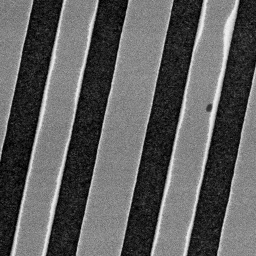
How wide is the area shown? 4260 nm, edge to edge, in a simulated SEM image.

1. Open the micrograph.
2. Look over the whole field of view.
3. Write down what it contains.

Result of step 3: lines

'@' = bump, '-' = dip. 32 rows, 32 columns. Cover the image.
@@@@----@@@@----@@@@@@---@@@@@--
@@@@----@@@@----@@@@@----@@@@@--
@@@@---@@@@@----@@@@@----@@@@---
@@@----@@@@@---@@@@@@----@@@@---
@@@----@@@@----@@@@@@----@@@@---
@@@----@@@@----@@@@@@---@@@@@---
@@@----@@@@----@@@@@----@@@@----
@@@---@@@@@----@@@@@----@@@@----
@@----@@@@@---@@@@@@----@@@@----
@@----@@@@----@@@@@@---@@@@@----
@@----@@@@----@@@@@----@@@@@---@
@@----@@@@----@@@@@----@@@@----@
@@---@@@@@----@@@@@----@@@@----@
@----@@@@----@@@@@@----@@@@----@
@----@@@@----@@@@@@----@@@@----@
@----@@@@----@@@@@----@@@@@---@@
@----@@@@----@@@@@----@@@@----@@
----@@@@@----@@@@@----@@@@----@@
----@@@@----@@@@@@----@@@@----@@
----@@@@----@@@@@@----@@@@----@@
----@@@@----@@@@@----@@@@@---@@@
----@@@@----@@@@@----@@@@----@@@
---@@@@@---@@@@@@----@@@@----@@@
---@@@@----@@@@@@----@@@@----@@@
---@@@@----@@@@@@---@@@@@----@@@
---@@@@----@@@@@----@@@@@----@@@
--@@@@@----@@@@@----@@@@----@@@@
--@@@@@---@@@@@@----@@@@----@@@@
--@@@@----@@@@@@----@@@@----@@@@
--@@@@----@@@@@----@@@@@----@@@@
--@@@@----@@@@@----@@@@----@@@@@
-@@@@@----@@@@@----@@@@----@@@@@